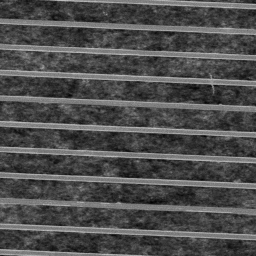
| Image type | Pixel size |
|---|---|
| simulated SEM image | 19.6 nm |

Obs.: parallel lines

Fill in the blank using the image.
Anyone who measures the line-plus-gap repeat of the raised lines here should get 500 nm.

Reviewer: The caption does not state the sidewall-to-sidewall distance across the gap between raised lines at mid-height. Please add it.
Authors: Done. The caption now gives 0.41 micrometres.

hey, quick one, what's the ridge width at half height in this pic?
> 95.2 nm